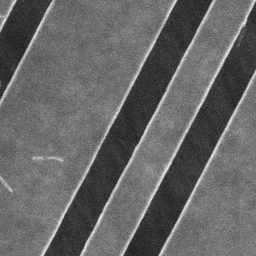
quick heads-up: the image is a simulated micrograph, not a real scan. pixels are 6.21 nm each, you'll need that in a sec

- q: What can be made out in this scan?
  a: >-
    lines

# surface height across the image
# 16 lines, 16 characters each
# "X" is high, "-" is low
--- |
X--XXXXXXXX--XXX
--XXXXXXXX---XX-
--XXXXXXXX--XXX-
-XXXXXXXX--XXX--
-XXXXXXXX--XXX--
XXXXXXXX--XXX--X
XXXXXXXX--XXX--X
XXXXXXX--XXX--XX
XXXXXXX--XXX--XX
XXXXXX--XXX--XXX
XXXXXX--XXX--XXX
XXXXX--XXX--XXXX
XXXXX--XX---XXXX
XXXX--XXX--XXXXX
XXXX--XX---XXXXX
XXX--XXX--XXXXXX